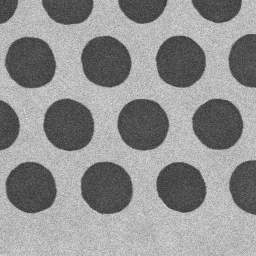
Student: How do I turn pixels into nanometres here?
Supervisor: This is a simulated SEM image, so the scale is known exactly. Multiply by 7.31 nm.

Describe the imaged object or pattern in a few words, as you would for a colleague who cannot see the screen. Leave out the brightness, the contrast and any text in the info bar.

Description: a regular array of holes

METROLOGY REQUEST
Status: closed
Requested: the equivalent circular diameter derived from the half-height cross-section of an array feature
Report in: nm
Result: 373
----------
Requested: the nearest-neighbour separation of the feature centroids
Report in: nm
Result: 533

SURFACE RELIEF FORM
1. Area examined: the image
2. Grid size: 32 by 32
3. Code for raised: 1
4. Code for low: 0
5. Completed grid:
00111000000011100000011100000011
00111100000111100000111110000011
01111110000111110001111111000111
11111111111111111111111111111111
11111111111110111111110111111100
11000011111000011111000001111000
10000001110000001111000001111000
10000001110000001110000000111000
10000001110000001111000000111000
10000001111000001111000001111000
11000011111100011111100011111100
11111111111111111111111111111111
11111110011111111001111111001111
01111100000111100000111110000011
00111100000111100000011100000011
00111000000011100000011100000011
00111100000011100000011100000011
00111100000111100000011110000011
01111110001111110001111111000111
11111111111111111111111111111111
11000111111100111111100011111100
10000011111000001111000001111000
10000001110000001111000001111000
10000001110000000111000000111000
10000001110000000111000000111000
11000001111000001111100001111000
11100111111100011111110011111110
11111111111111111111111111111111
11111111111111111111111111111111
11111111111111111111111111111111
11111111111111111111111111111111
11111111111111111111111111111111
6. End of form